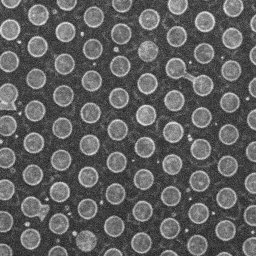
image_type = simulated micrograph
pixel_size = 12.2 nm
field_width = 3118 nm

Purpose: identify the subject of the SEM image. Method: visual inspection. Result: a regular array of raised bodies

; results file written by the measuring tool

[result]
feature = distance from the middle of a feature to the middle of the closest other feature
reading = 0.386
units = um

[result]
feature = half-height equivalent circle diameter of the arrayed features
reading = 232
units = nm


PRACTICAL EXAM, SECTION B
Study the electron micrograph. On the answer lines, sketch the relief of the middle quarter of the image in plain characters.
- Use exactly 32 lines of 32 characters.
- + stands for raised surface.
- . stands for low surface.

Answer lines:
++..........++++..........++++..
++..........++++..........++++..
.....+++.....++...........+++++.
.....++++..........++++........+
.....++++..........++++.........
.....++++..........++++.........
++....++.....++....++++.........
++..........++++..........+++...
++..........++++.........+++++..
++..........++++.........+++++..
.....+++.....++.....+.....++++..
.....++++..........+++.....+....
....+++++.........+++++.........
.....++++.........+++++.........
+.....+.....+++....+++..........
++.........+++++.........++++...
++.........+++++.........+++++..
+..........+++++.........+++++..
.....+++....+++.....+....++++...
....+++++.........++++..........
....+++++.........+++++.........
....++++..........+++++.........
+.....+.....++.....+++..........
++.........++++..........++++...
++.........++++..........++++...
+..........++++..........++++...
.....+++....++.....+.....++++...
....++++..........++++..........
....++++..........++++..........
....++++..........++++..........
+....++.....++....+++...........
+..........++++..........+++....